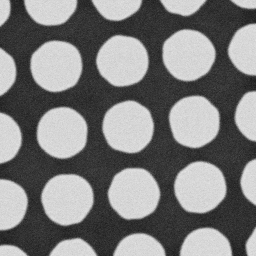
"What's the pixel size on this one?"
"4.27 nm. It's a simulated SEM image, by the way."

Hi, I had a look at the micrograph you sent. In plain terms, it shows an array of small figures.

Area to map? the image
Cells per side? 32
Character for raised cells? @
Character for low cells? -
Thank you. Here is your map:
@--@@@@@@@--@@@@@@--@@@@@----@@@
@--@@@@@@---@@@@@----@@@--------
@---@@@@------@-----------------
------------------------------@@
---------------------@@@@@---@@@
------@@@----@@@@@--@@@@@@@--@@@
@---@@@@@@--@@@@@@--@@@@@@@--@@@
@@--@@@@@@--@@@@@@@-@@@@@@@--@@@
@@--@@@@@@--@@@@@@---@@@@@----@@
@@--@@@@@@---@@@@@----@@@-------
@@---@@@@-----@@@---------------
@------------------------------@
-----------------------@@@----@@
-------@@-----@@@@----@@@@@---@@
@----@@@@@---@@@@@@--@@@@@@--@@@
@@---@@@@@@--@@@@@@--@@@@@@---@@
@@@--@@@@@@--@@@@@@---@@@@@---@@
@@@--@@@@@@--@@@@@@---@@@@-----@
@@---@@@@@----@@@@--------------
@@-----@@-----------------------
------------------------@@-----@
---------------@@@@---@@@@@@--@@
@-----@@@@@---@@@@@---@@@@@@--@@
@@@---@@@@@---@@@@@@--@@@@@@--@@
@@@--@@@@@@@--@@@@@@--@@@@@@---@
@@@--@@@@@@@--@@@@@@---@@@@-----
@@@---@@@@@----@@@@-----@@------
@@@----@@@----------------------
@------------------------@------
----------------@@@----@@@@@---@
-------@@@@----@@@@@---@@@@@@--@
@@@---@@@@@@--@@@@@@@--@@@@@@--@